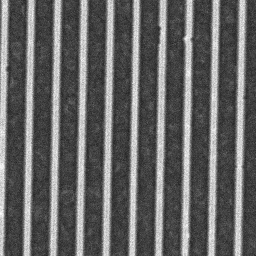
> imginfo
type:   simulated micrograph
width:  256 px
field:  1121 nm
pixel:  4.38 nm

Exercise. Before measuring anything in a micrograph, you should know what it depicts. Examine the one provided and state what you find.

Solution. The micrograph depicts parallel lines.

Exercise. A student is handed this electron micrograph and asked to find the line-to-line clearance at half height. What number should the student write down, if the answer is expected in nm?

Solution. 85.4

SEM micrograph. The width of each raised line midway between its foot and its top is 30.1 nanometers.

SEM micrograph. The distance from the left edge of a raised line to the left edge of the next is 0.116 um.